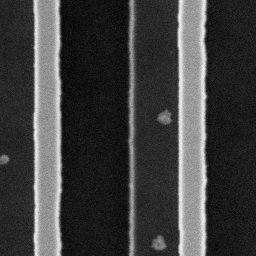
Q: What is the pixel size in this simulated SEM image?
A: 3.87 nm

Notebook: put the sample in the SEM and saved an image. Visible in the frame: lines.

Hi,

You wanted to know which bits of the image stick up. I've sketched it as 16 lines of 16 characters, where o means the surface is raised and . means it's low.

oooo....ooooo...
oooo....ooooo...
oooo....ooooo...
oooo....ooooo...
oooo....ooooo...
oooo....ooooo...
oooo....ooooo...
oooo....ooooo...
oooo....ooooo...
oooo....ooooo...
oooo....ooooo...
oooo....ooooo...
oooo....ooooo...
oooo....ooooo...
oooo....ooooo...
oooo....ooooo...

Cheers